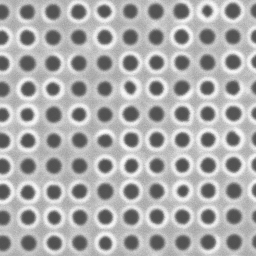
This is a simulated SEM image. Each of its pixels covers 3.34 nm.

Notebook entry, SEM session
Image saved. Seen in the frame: a regular array of holes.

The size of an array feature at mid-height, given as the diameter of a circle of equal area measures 50.5 nanometers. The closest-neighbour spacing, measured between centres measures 85.1 nm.